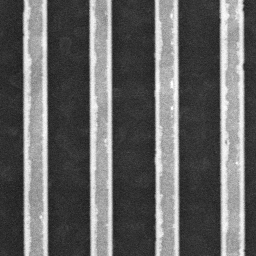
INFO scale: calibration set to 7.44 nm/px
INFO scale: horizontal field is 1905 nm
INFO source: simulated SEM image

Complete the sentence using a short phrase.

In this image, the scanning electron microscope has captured one or a few lines or trenches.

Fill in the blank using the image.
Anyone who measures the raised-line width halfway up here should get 0.14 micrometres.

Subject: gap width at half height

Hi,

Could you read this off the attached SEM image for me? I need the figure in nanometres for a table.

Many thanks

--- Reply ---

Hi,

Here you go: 355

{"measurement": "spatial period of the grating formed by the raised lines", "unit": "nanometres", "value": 488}